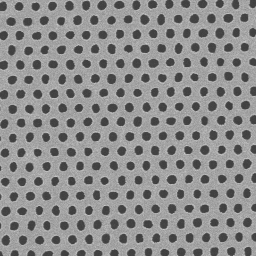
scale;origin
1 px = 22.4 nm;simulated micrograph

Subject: a regular array of holes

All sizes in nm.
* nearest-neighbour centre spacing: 363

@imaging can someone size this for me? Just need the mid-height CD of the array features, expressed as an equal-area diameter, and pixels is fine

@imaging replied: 8.81